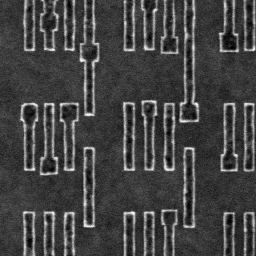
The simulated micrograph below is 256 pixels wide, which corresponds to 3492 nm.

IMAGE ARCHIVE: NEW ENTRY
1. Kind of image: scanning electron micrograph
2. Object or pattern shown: wiring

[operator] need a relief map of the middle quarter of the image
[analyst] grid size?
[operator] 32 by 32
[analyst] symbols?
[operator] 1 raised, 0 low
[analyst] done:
00000110000000000000000000000011
00000110000000000000000000000011
00000110000000000000000000000011
00000110000000000000000000000011
00000110000000000000000000000011
00000110000000000000000000000011
00000110000000000000000000000011
00000110000000000000000000000011
00000110000000000000000000000011
00000110000000000000111000000011
11100110000000011100111001100111
11100110000000011100111001100111
11100110000000011100111001100111
11100000000000011100110001110111
11100000000000011100110001110000
11000000000000011100110001110000
11000000000000011100110001100000
11000000000000011000110001100000
11000000000000011100110001100000
11000000000000011100110001100000
11000000000000011000110001100000
11000110000000011000110001100011
11000110000000011000110001100011
11000110000000011000110001100011
11000110000000011100110001100011
11000110000000011100110001100011
00000110000000000000000000000011
00000110000000000000000000000011
00000110000000000000000000000011
00000110000000000000000000000011
00000110000000000000000000000011
00000110000000000000000000000011